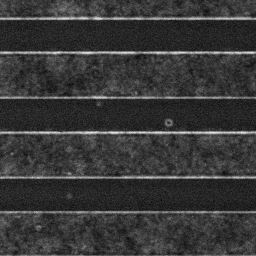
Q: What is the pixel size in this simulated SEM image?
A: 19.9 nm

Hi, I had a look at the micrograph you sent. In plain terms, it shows lines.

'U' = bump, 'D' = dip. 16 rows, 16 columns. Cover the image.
UUUUUUUUUUUUUUUU
DDDDDDDDDDDDDDDD
DDDDDDDDDDDDDDDD
UUUUUUUUUUUUUUUU
UUUUUUUUUUUUUUUU
UUUUUUUUUUUUUUUU
DDDDDDDDDDDDDDDD
DDDDDDDDDDDDDDDD
UUUUUUUUUUUUUUUU
UUUUUUUUUUUUUUUU
UUUUUUUUUUUUUUUU
DDDDDDDDDDDDDDDD
DDDDDDDDDDDDDDDD
UUUUUUUUUUUUUUUU
UUUUUUUUUUUUUUUU
UUUUUUUUUUUUUUUU